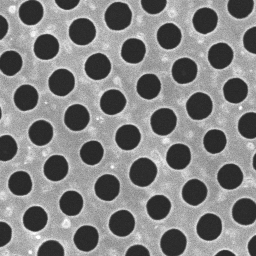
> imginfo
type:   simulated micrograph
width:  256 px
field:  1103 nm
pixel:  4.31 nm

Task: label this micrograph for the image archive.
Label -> a regular array of holes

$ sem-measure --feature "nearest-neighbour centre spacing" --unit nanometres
164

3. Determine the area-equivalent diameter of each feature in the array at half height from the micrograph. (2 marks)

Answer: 110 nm